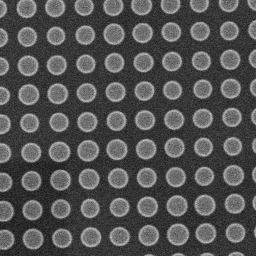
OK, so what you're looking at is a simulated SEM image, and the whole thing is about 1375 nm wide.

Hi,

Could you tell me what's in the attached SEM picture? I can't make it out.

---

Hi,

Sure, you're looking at an array of small figures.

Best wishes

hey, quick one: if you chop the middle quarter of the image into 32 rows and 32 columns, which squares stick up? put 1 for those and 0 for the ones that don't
10011111001111100011110001111000
00001110000111000001100000110000
00000000000000000000000000000000
00000000000000000000000000000000
00000000000000000000000000110000
00001110000111100011110001111000
10011111000111100011110001111000
10011111000111100011110001111000
10001111000111100001110000110000
00000000000000000000000000000000
00000000000000000000000000000000
00000000000000000000000000000000
00000110000011100011110000111000
10001111000111100011111001111100
10011111000111100011111001111100
10001111000111100011110000111000
00001110000011000000000000000000
00000000000000000000000000000000
00000000000000000000000000000000
00000110000111100001110000111100
10001111000111110011111001111100
10001111100111110011111001111100
10001111000111100001111000111100
10001111000011000001100000000000
00000000000000000000000000000000
00000000000000000000000000000000
00000110000011100001110000111000
10001111000111110011111000111100
10001111100111110011111000111100
10001111100111110001111000111100
10000111000011100001110000011000
00000000000000000000000000000000